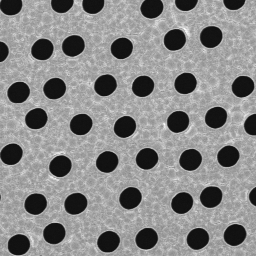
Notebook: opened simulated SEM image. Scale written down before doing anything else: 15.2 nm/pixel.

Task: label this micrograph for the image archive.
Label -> a regular array of holes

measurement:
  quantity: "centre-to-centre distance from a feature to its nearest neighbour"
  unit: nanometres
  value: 573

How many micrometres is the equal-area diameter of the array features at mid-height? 0.328